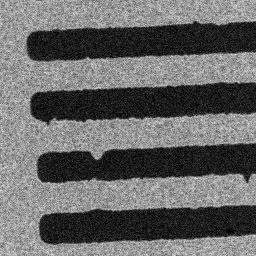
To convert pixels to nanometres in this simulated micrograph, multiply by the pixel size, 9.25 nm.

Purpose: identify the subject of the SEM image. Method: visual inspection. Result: one or a few lines or trenches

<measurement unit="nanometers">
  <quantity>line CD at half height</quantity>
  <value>273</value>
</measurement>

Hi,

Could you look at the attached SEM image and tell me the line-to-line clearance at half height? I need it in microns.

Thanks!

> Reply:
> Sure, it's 0.291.